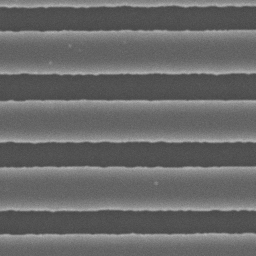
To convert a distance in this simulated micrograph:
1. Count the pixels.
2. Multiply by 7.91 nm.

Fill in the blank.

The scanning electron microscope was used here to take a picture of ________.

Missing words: lines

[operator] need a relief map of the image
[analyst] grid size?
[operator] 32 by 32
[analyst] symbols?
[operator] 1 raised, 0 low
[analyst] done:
11111111111111111111111111111111
00000000000000000000000000000000
00000000000000000000000000000000
00000000000000000000000000000000
11111111111111111111111111111111
11111111111111111111111111111111
11111111111111111111111111111111
11111111111111111111111111111111
11111111111111111111111111111111
00000000000000000000000000000000
00000000000000000000000000000000
00000000000000000000000000000000
00000000001000000000000000000000
11111111111111111111111111111111
11111111111111111111111111111111
11111111111111111111111111111111
11111111111111111111111111111111
11111111111111111111111111111111
00000000000000000000000000000000
00000000000000000000000000000000
00000000000000000000000000000000
11111111111111111111111111111111
11111111111111111111111111111111
11111111111111111111111111111111
11111111111111111111111111111111
11111111111111111111111111111111
00000000000000000000000000000000
00000000000000000000000000000000
00000000000000000000000000000000
11111111111111111111111111111111
11111111111111111111111111111111
11111111111111111111111111111111